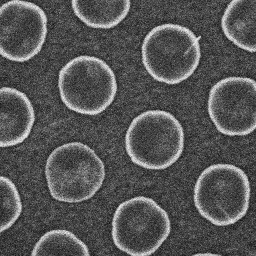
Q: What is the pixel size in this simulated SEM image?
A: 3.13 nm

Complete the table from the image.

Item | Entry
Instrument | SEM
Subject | raised bodies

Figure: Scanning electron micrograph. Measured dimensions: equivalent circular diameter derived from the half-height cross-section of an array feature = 0.176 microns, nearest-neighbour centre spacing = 272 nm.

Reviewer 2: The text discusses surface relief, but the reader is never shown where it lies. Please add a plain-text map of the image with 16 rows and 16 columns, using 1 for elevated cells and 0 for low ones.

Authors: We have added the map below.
1100011100000011
1110001000000011
1110000001110001
1100000001110000
0000111001110000
0000111000000111
1100111000000111
1100000001100111
1100000011100000
0000000011100000
0000000000000110
1000000000001110
1000000010001110
1000000111000110
0001000111000000
0011100011000000